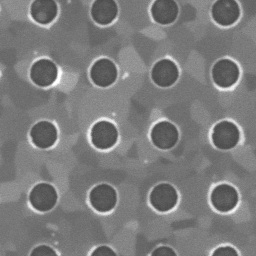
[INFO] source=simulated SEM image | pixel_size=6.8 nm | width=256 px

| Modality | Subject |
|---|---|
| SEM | a regular array of holes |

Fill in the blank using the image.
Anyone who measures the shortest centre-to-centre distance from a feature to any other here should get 410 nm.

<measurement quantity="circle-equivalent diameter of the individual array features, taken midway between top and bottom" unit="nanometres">196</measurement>